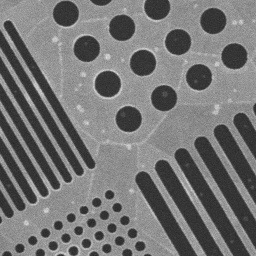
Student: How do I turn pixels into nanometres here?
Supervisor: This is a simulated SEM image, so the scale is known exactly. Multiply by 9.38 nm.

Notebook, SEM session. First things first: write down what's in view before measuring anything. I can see groups of lines, slits or small figures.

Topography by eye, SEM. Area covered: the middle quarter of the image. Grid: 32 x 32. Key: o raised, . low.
oooooooooooooooo.......ooooooooo
ooooooooooooooooo......oooooooo.
ooooooooo....ooooo....ooooooooo.
oooooooo......oooooooooooooooo..
ooooooo.......ooooooooooooooooo.
ooooooo........oooooooo....oooo.
oooooooo......oooooooo......oooo
oooooooo......oooooooo...o..oooo
ooooooooooooooooooooo.......oooo
oooooooooooooooooooooo......oooo
ooooooooooooooo..ooooo......oooo
oooooooooooooo.....oooo....ooooo
.oooooooooooo......ooooooooooooo
.oooooooooooo.......oooooooooooo
..ooooooooooo.......oooooooooooo
...oooooooooo......ooooooooooooo
...ooooooooooo....oooooooooooooo
o...oooooooooooooooooooooooooooo
o...oooooooooooooooooooooooooooo
.o...ooooooooooooooooooooooooooo
..o...oooooooooooooooooooooooooo
..o...oooooooooooooooooooooo...o
...o...oooooooooooooooooooo.....
...o...oooooooooooooooooooo.....
o...o...ooooooooooooooo...oo....
oo...o..oooooooooooooo.....oo...
.o...oooooooooooooooooo....oo...
..o..ooooooooooooo...oo.....oo..
..oooooooooooooooo....oo.....o..
..oooooooooooooooo....oo.....oo.
oooooooooooooooooo.....oo.....oo
ooooooooooooooooooo.....oo.....o